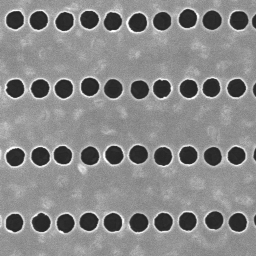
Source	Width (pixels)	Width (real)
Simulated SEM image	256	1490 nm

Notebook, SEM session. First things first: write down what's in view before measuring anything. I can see a regular array of holes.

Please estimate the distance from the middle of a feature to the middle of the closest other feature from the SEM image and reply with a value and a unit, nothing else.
139 nanometres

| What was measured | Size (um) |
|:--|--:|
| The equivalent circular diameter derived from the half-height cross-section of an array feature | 0.109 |